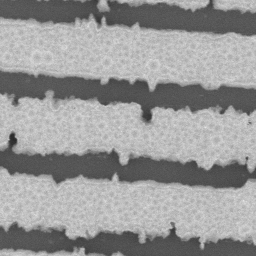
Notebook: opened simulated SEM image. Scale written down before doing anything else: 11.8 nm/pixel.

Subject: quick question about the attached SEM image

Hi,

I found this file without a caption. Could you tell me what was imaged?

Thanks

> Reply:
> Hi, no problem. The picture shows one or a few lines or trenches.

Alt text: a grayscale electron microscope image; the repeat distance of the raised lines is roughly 0.903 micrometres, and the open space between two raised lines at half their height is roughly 323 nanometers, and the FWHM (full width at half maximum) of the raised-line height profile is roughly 585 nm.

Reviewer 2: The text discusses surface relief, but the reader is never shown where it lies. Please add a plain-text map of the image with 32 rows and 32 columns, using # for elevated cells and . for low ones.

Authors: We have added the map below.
......................####.#####
................................
#..........#....................
###############.#...............
##########################.###..
################################
################################
################################
################################
...........#####################
...................#.....###.###
................................
#.###....#......................
##################..............
##################.#############
##################.#############
################################
#.##############################
..#.############################
...............#...##.##########
.........................##....#
#...............................
######...##...#.................
#########################.....##
################################
################################
################################
################################
........#############.##########
.........#............######.###
................................
..#......##.....................